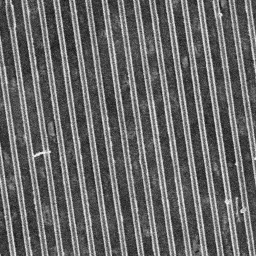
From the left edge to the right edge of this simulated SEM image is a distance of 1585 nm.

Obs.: parallel lines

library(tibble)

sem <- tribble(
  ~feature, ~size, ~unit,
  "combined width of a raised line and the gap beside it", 97.7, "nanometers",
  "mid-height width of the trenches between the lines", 0.0651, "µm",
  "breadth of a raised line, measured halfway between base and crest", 29.8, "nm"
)